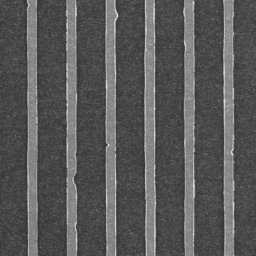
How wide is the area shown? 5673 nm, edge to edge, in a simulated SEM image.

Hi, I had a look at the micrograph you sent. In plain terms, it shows parallel lines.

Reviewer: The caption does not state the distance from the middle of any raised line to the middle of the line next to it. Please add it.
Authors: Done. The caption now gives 869 nanometers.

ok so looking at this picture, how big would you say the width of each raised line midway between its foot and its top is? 202 nm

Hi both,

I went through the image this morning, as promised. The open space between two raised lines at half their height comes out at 0.67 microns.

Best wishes